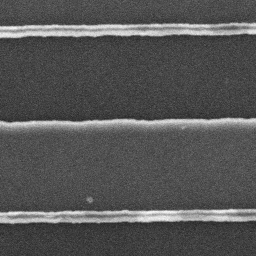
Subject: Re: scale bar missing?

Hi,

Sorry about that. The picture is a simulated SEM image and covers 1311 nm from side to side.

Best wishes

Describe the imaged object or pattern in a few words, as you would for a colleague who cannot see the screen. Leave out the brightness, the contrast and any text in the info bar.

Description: lines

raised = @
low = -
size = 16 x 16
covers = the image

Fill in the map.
@@@@@@@@@@@@@@@@
@@@@@@@@@@@@@@@@
----------------
----------------
----------------
----------------
----------------
--------------@@
@@@@@@@@@@@@@@@@
@@@@@@@@@@@@@@@@
@@@@@@@@@@@@@@@@
@@@@@@@@@@@@@@@@
@@@@@@@@@@@@@@@@
@@@@@@@@@@@@@@@@
----------------
----------------